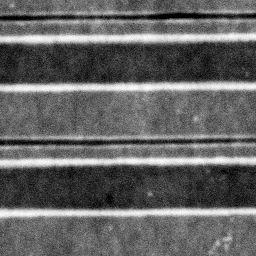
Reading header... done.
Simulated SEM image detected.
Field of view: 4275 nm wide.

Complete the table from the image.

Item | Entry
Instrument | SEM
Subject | lines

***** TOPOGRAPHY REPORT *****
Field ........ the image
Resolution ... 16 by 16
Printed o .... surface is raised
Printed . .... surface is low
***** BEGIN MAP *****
oooooooooooooooo
oooooooooooooooo
................
................
................
..........oooooo
oooooooooooooooo
oooooooooooooooo
oooooooooooooooo
oooooooooooooooo
................
................
................
oooooooooooooooo
oooooooooooooooo
oooooooooooooooo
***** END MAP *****